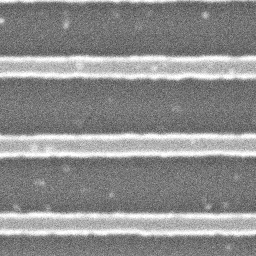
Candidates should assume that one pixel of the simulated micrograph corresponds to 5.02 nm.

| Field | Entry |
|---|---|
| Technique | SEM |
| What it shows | lines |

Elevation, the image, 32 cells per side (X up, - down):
--------------------------------
--------------------------------
--------------------------------
--------------------------------
--------------------------------
--------------------------------
--------------------------------
XXXXXXXXXXXXXXXXXXXXXXXXXXXXXXXX
XXXXXXXXXXXXXXXXXXXXXXXXXXXXXXXX
X----XXXX--XXXXXXXXXXXXXXXXXXXXX
--------------------------------
--------------------------------
--------------------------------
--------------------------------
--------------------------------
--------------------------------
--------------------------------
XXXXXXXXXXXXXXXXXXXXXXXXXXXXXXXX
XXXXXXXXXXXXXXXXXXXXXXXXXXXXXXXX
X-------------------------------
--------------------------------
--------------------------------
--------------------------------
--------------------------------
--------------------------------
--------------------------------
--------------------------------
XXXXXXXXXXXXXXXXXXXXXXXXXXXXXXXX
XXXXXXXXXXXXXXXXXXXXXXXXXXXXXXXX
--------------------------------
--------------------------------
--------------------------------